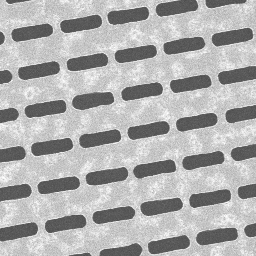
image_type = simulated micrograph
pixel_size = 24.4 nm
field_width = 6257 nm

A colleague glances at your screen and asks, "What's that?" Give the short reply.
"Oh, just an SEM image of a regular array of holes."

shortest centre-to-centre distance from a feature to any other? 946 nm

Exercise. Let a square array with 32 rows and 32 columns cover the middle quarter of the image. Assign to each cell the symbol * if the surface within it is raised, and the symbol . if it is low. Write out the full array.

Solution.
*.........**********************
*....***************************
********************************
******************************..
***************************.....
*****************........*......
***************..........**.....
*****.......**..........********
**...........**.....************
**..........********************
.*.......***********************
.***.***************************
********************************
*****************************...
***********************..***....
*****************.........**....
************.***..........***...
*****.........**..........******
****..........**....************
..**.........*******************
..**.....***********************
.*******************************
********************************
******************************..
**********************......**..
******************..........**..
*********.......*...........***.
******..........*.......********
...**...........**..************
....**.......*******************
....****************************
..******************************